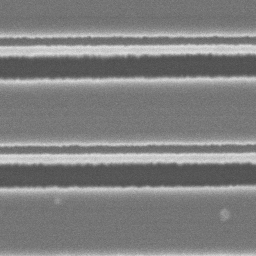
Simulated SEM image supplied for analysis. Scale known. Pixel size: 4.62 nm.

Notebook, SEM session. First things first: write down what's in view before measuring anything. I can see lines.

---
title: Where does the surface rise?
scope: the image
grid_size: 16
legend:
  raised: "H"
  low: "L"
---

HHHHHHHHHHHHHHHH
HHHHHHHHHHHHHHHH
HHHHHHHHHHHHHHHH
LLLLLLLLLLLLLLLL
LLLLLLLLLLLLLLLL
HHHHHHHHHHHHHHHH
HHHHHHHHHHHHHHHH
HHHHHHHHHHHHHHHH
HHHHHHHHHHHHHHHH
HHHHHHHHHHHHHHHH
LLLLLLLLLLLLLLLL
LLLLLLLLLLLLLLLL
HHHHHHHHHHHHHHHH
HHHHHHHHHHHHHHHH
HHHHHHHHHHHHHHHH
HHHHHHHHHHHHHHHH